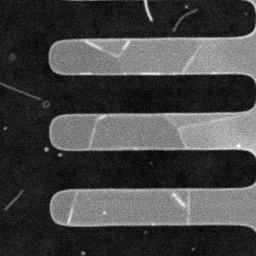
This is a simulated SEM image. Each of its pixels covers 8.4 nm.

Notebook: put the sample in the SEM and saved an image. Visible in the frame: groups of lines, slits or small figures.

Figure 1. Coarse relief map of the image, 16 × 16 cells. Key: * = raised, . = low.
................
................
....************
...*************
....************
................
................
...*************
...*************
................
................
................
...*************
...*************
................
................